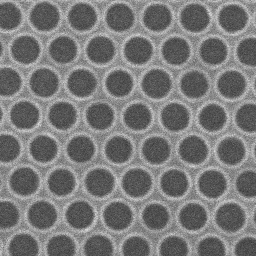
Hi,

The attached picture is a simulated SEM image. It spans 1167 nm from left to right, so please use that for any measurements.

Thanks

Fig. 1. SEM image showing a regular array of holes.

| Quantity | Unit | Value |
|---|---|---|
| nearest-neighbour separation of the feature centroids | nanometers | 170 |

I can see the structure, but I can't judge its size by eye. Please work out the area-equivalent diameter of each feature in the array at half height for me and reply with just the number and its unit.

30 px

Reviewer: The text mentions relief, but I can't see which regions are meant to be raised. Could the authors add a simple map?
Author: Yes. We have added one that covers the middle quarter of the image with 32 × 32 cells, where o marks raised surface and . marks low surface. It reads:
oooooooooooooooooooooooooooooooo
oo....oooooo...oooooo....ooooooo
o......oooo.....oooo......oooo..
o.......oo.......oo........oo...
o.......oo........o........oo...
o.......oo.......oo........oo...
o.......oo.......oo........oo...
oo.....oooo.....oooo......oooo..
oooo.oooooooo.ooooooo....oooooo.
.ooooooo.oooooooooooooooooo..ooo
..oooo.....ooooo.....oooo.....oo
...oo.......ooo.......oo.......o
...oo........oo.......oo........
...oo........oo.......oo........
...ooo......ooo.......oo........
..oooo......ooo......oooo......o
.ooooooo..ooooooo...oooooo....oo
oooooooooooooooooooooooooooooooo
oo.....oooo.....ooooo....ooooo..
o.......ooo......ooo......ooo...
o.......oo.......ooo......ooo...
........oo.......oo........o....
o.......oo.......oo........oo...
o......oooo......ooo......ooo...
oo....oooooo....ooooo....ooooo..
oooooooooooooooooooooooooooooooo
..oooo.....ooooo....oooooo...ooo
..ooo.......ooo......oooo......o
...oo........o........oo.......o
...oo........o........oo.......o
...oo........o........oo.......o
..ooo.......ooo.......oo.......o